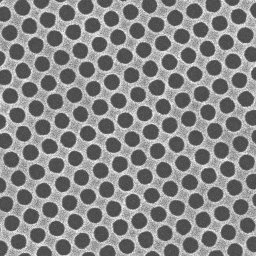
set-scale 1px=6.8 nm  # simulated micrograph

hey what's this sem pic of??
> a regular array of holes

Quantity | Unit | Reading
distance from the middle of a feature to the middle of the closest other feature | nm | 134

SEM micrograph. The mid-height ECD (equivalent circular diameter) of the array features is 0.106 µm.